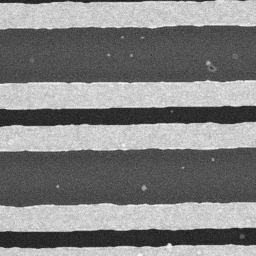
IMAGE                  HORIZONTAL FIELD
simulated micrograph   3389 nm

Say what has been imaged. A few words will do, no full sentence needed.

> lines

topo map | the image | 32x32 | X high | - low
XXX--XXXXXXXXXXXXXXXXXXXXXXXXXXX
XXXXXXXXXXXXXXXXXXXXXXXXXXXXXXXX
XXXXXXXXXXXXXXXXXXXXXXXXXXXXXXXX
X---X-X-------------------------
--------------------------------
--------------------------------
--------------------------------
--------------------------------
--------------------------------
--------------------------------
---XXXXXXXXXXXXXXXXXXXXXXXXXXXXX
XXXXXXXXXXXXXXXXXXXXXXXXXXXXXXXX
XXXXXXXXXXXXXXXXXXXXXXXXXXXXXXXX
XXXXX-XX------------------------
--------------------------------
-------------------XXXXXXXXX-XXX
XXXXXXXXXXXXXXXXXXXXXXXXXXXXXXXX
XXXXXXXXXXXXXXXXXXXXXXXXXXXXXXXX
XXXXXXXXXXXXXXXXXXX-XXXXXXXX----
--------------------------------
--------------------------------
--------------------------------
--------------------------------
--------------------------------
--------------------------------
-----------------------XXXXXXXXX
XXXXXXXXXXXXXXXXXXXXXXXXXXXXXXXX
XXXXXXXXXXXXXXXXXXXXXXXXXXXXXXXX
XXXXXXXXXXXXXXXXXXXXXXXXX-------
--------------------------------
--------------------------------
XXXXXXXXXXXXXXXXXXXXXXXXXXXXXXXX